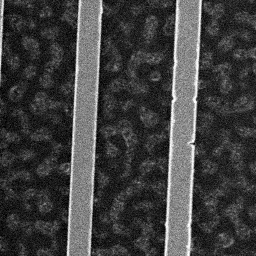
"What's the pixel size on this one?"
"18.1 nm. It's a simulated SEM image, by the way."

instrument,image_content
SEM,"one or a few lines or trenches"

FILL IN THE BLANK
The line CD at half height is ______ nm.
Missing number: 398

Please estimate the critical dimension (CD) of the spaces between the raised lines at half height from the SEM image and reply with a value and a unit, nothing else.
1380 nanometres